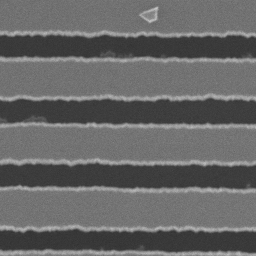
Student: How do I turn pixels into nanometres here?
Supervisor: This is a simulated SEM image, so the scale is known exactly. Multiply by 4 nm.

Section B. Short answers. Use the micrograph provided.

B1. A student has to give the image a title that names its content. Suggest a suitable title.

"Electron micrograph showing lines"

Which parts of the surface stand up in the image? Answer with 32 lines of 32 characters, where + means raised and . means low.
++++++++++++++++++++++++++++++++
++++++++++++++++++++++++++++++++
++++++++++++++++++++++++++++++++
++++++++++++++++++++++++++++++++
.+...+..+.+++.++++++++++++++..++
................................
................................
++++++++++++++++++++++++++++++++
++++++++++++++++++++++++++++++++
++++++++++++++++++++++++++++++++
++++++++++++++++++++++++++++++++
++++++++++++++++++++++++++++++++
++.++++++++...++++++.++++...+.++
................................
................................
++++++++++++++.++++...+.........
++++++++++++++++++++++++++++++++
++++++++++++++++++++++++++++++++
++++++++++++++++++++++++++++++++
++++++++++++++++++++++++++++++++
+++++++++++..+++++++++++++++++++
................................
................................
+++++++++++++++..+.....++.+.....
++++++++++++++++++++++++++++++++
++++++++++++++++++++++++++++++++
++++++++++++++++++++++++++++++++
++++++++++++++++++++++++++++++++
++++++++++++++++++++++++++++++++
................................
................................
+++++++++++++++++++++..+++++++..